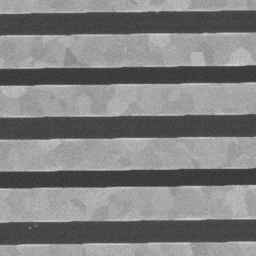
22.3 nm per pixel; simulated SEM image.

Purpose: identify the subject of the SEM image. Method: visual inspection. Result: lines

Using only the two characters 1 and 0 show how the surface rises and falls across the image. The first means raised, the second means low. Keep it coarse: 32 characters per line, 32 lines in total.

11111111111111111111111111111111
11111111111000000000000000000000
00000000000000000000000000000000
00000000000000000000000000000000
11111111111111111111111111111111
11111111111111111111111111111111
11111111111111111111111111111111
11111111111111111111111111111111
11111100000000000000000000000000
00000000000000000000000000000000
00000000000000000000001111111111
11111111111111111111111111111111
11111111111111111111111111111111
11111111111111111111111111111111
11111100000000000000000000000000
00000000000000000000000000000000
00000000000000000000000000000000
00000011111111111111111111111111
11111111111111111111111111111111
11111111111111111111111111111111
11111111111111111111111111111111
00000000000000000000000000000000
00000000000000000000000000000000
00000000000001111111111111111111
11111111111111111111111111111111
11111111111111111111111111111111
11111111111111111111111111111111
11111111111111111000000000000000
00000000000000000000000000000000
00000000000000000000000000000000
00000000000000000011111111111111
11111111111111111111111111111111